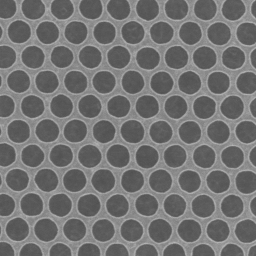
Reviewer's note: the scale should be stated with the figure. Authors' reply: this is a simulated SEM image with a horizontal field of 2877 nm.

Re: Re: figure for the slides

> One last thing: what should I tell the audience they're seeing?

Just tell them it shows a regular array of holes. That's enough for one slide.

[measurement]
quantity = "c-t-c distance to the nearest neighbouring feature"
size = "0.316 microns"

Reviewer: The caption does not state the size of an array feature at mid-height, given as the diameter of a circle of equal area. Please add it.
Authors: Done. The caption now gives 264 nanometres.